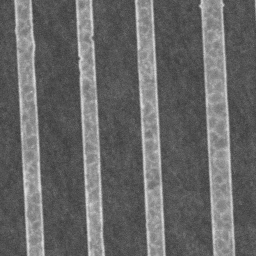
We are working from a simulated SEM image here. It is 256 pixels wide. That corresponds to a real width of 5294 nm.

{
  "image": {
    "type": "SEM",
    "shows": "one or a few lines or trenches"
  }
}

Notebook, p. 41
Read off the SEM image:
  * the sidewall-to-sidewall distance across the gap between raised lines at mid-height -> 934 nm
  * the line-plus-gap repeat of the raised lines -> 1300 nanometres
